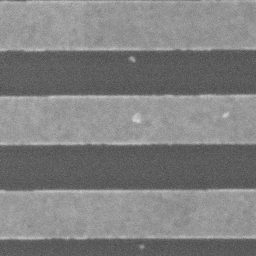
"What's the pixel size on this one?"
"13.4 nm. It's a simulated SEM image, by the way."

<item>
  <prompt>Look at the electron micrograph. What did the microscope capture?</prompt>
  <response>lines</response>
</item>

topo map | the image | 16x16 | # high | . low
################
################
################
................
................
................
################
################
################
................
................
................
################
################
################
................